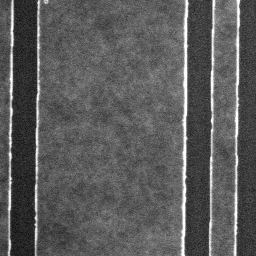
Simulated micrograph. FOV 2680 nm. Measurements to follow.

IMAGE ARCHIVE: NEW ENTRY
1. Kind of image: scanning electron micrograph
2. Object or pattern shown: lines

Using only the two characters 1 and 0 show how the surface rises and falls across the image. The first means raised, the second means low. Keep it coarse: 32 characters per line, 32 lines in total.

11000111111111111111111000011100
11000111111111111111111000011100
11000111111111111111111000011100
11000111111111111111111000011100
11000111111111111111111000011100
11000111111111111111111000011100
10000111111111111111111000011100
10000111111111111111111000011100
10000111111111111111111000011100
10000111111111111111111000111100
10000111111111111111111000111100
10000111111111111111111000111100
10000111111111111111111000111100
10000111111111111111111000111100
10000111111111111111111000111100
10000111111111111111111000111100
10000111111111111111111000111100
10000111111111111111111000111100
10000111111111111111111000111100
10000111111111111111111000111100
10000111111111111111111000111100
10000111111111111111111000111100
10000111111111111111111000111100
10001111111111111111111000111100
10001111111111111111111000111100
10001111111111111111111000111100
10001111111111111111111000111100
10000111111111111111111000111100
10001111111111111111111000111000
10001111111111111111111000111000
10001111111111111111111000111000
10001111111111111111111000111000